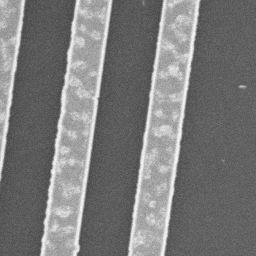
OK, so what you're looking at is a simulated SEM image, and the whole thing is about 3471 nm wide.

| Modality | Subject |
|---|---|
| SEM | one or a few lines or trenches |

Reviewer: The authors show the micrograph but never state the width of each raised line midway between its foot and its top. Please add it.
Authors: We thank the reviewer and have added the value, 0.44 µm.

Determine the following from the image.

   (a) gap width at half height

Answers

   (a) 732 nm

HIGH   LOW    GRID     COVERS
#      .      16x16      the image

#....##...##....
#....##...##....
#....##...##....
#...##....##....
#...##....##....
#...##....##....
#...##...##.....
....##...##.....
....##...##.....
....##...##.....
...##....##.....
...##....##.....
...##....##.....
...##...##......
...##...##......
...##...##......